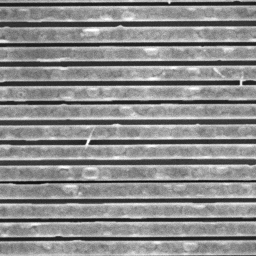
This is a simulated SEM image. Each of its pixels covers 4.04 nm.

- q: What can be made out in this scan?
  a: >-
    parallel lines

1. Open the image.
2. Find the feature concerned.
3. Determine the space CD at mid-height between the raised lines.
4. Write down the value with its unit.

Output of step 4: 21.2 nanometers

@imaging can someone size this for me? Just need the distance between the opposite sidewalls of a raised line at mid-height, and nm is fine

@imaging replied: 57.6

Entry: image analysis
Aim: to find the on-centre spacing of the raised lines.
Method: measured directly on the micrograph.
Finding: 79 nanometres